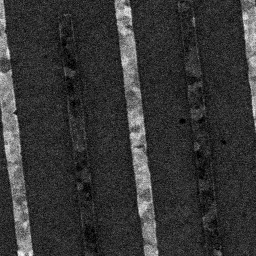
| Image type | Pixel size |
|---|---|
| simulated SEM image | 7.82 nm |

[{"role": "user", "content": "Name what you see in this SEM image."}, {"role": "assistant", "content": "parallel lines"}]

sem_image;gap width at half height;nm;378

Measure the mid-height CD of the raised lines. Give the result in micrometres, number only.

0.109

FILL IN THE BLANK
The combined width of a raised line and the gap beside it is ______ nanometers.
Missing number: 484